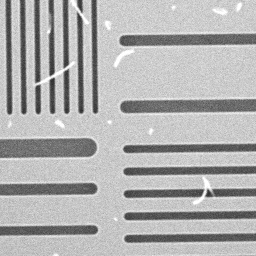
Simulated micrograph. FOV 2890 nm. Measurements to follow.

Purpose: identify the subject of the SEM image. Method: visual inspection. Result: groups of lines, slits or small figures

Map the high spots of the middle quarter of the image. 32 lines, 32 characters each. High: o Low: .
.oo..oo.oooooooooooooooooooooooo
.oo..oo.oooooooooooooooooooooooo
.oo..oo.oooooooooooooooooooooooo
.oo..oo.oooooooooooooooooooooooo
.oo..oo..ooooooooooooooooooooooo
..o..oo..ooooooooooooooooooooooo
..o..oo..ooooooooooooooooooooooo
..o..oo..ooooooooooooooooooooooo
..o..oo..ooooooooooooooooooooooo
..o..oo..oooooo.................
..oo.oo..ooooo..................
..oo.oo..ooooo..................
oooooooooooooooooooooooooooooooo
oooooooooooooooooooooooooooooooo
oooooooooooooooooooooooooooooooo
oooooooooooooooooooooooooooooooo
oooooooooooooooooooooooooooooooo
oooooooooooooooooooooooooooooooo
......oooooooooooooooooooooooooo
........oooooooooooooooooooooooo
........ooooooo.................
........ooooooo.................
........oooooooo.ooooooooooooooo
......oooooooooooooooooooooooooo
oooooooooooooooooooooooooooooooo
oooooooooooooooooooooooooooooooo
ooooooooooooooo.................
ooooooooooooooo.................
oooooooooooooooooooooooooooooooo
oooo...ooooooooooooooooooooooooo
........oooooooooooooooooooooooo
........oooooooo................